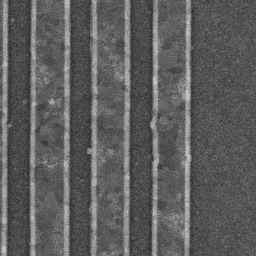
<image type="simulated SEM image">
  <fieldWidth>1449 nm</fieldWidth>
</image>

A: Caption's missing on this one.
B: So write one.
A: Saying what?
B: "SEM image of one or a few lines or trenches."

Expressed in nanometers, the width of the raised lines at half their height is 184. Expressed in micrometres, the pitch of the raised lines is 0.344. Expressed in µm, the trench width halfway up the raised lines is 0.16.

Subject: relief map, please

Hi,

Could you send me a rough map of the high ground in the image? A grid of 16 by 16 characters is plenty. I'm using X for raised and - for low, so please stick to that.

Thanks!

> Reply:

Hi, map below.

--XX--XX--XX----
--XX--XX--XX----
--XX--XX--XX----
--XX--XX--XX----
--XX--XX--XX----
--XX--XX--XX----
--XX--XX--XX----
--XX--XX--XX----
--XX--XX--XX----
--XX--XX--XX----
--XX--XX--XX----
--XX--XX--XX----
--XX--XX--XX----
--XX--XX--XX----
--XX--XX--XX----
--XX--XX--XX----